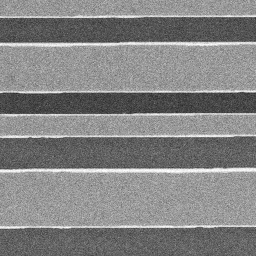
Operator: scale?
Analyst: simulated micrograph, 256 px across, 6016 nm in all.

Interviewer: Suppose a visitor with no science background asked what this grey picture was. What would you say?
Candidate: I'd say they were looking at lines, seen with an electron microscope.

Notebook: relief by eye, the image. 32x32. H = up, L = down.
HHHHHHHHHHHHHHHHHHHHHHHHHHHHHHHH
HHHHHHHHHHHHHHHHHHHHHHHHHHHHHHHH
LLLLLLLLLLLLLLLLLLLLLLLLLLLLLLLL
LLLLLLLLLLLLLLLLLLLLLLLLLLLLLLLL
LLLLLLLLLLLLLLLLLLLLLLLLLLLLLLLL
LLLLLLLLLLLLLHHHHHHHHHHHHHHHHHHH
HHHHHHHHHHHHHHHHHHHHHHHHHHHHHHHH
HHHHHHHHHHHHHHHHHHHHHHHHHHHHHHHH
HHHHHHHHHHHHHHHHHHHHHHHHHHHHHHHH
HHHHHHHHHHHHHHHHHHHHHHHHHHHHHHHH
HHHHHHHHHHHHHHHHHHHHHHHHHHHHHHHH
HLHHHHHHLLLLLLLLLLLLLLLLLLLLLLLL
LLLLLLLLLLLLLLLLLLLLLLLLLLLLLLLL
LLLLLLLLLLLLLLLLLLLLLLLLLLLLLLLL
HHHHHHHHHHHHHHHHHHHHHHHHHHHHHHHH
HHHHHHHHHHHHHHHHHHHHHHHHHHHHHHHH
HHHHHHHHHHHHHHHHHHHHHHHHHHHHHHHH
LLLLLLLLLLLLLLLLLLLLLLLLLLLLLLLL
LLLLLLLLLLLLLLLLLLLLLLLLLLLLLLLL
LLLLLLLLLLLLLLLLLLLLLLLLLLLLLLLL
LLLLLLLLLLLLLLLLLLLLLLLLLLLLLLLL
HHHHHHHHHHHHHHHHHHHHHHHHHHHHHHHH
HHHHHHHHHHHHHHHHHHHHHHHHHHHHHHHH
HHHHHHHHHHHHHHHHHHHHHHHHHHHHHHHH
HHHHHHHHHHHHHHHHHHHHHHHHHHHHHHHH
HHHHHHHHHHHHHHHHHHHHHHHHHHHHHHHH
HHHHHHHHHHHHHHHHHHHHHHHHHHHHHHHH
HHHHHHHHHHHHHHHHHHHHHHHHHHHHHHHH
LLLLLLLLLLLLLLLLLLLLLLLLLLLLLLLL
LLLLLLLLLLLLLLLLLLLLLLLLLLLLLLLL
LLLLLLLLLLLLLLLLLLLLLLLLLLLLLLLL
LLLLLLLLLLLLLLLLLLLLLLLLLLLLLLLL